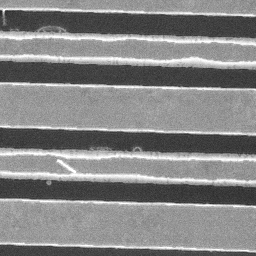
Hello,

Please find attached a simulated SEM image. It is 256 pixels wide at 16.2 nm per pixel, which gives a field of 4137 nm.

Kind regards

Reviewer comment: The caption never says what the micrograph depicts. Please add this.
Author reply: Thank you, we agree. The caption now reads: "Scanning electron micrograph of lines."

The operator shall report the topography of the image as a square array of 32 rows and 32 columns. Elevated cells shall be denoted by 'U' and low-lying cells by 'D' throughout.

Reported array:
UUUUUUUUUUUUUUUUUUUUUUUUUUUUUUUU
DDDDDDDDDDDDDDDUUUUUUUUUUUUUUUUU
DDDDDDDDDDDDDDDDDDDDDDDDDDDDDDDD
DDDDDDDDDDDDDDDDDDDDDDDDDDDDDDDD
UUUUUUUUUUUUDDDDDDDDDDDDDDDDDDDD
UUUUUUUUUUUUUUUUUUUUUUUUUUUUUUUU
UUUUUUUUUUUUUUUUUUUUUUUUUUUUUUUU
DDDDDDUUUUUUUUUUUUUUUUUUUUUUUUUU
DDDDDDDDDDDDDDDDDDDDDDDDDDDDDDDD
DDDDDDDDDDDDDDDDDDDDDDDDDDDDDDDD
UUUUUUDDDDDDDDDDDDDDDDDDDDDDDDDD
UUUUUUUUUUUUUUUUUUUUUUUUUUUUUUUU
UUUUUUUUUUUUUUUUUUUUUUUUUUUUUUUU
UUUUUUUUUUUUUUUUUUUUUUUUUUUUUUUU
UUUUUUUUUUUUUUUUUUUUUUUUUUUUUUUU
UUUUUUUUUUUUUUUUUUUUUUUUUUUUUUUU
DDDDDDDDDDDDDDDDDDDDDUUUUUUUUUUU
DDDDDDDDDDDDDDDDDDDDDDDDDDDDDDDD
DDDDDDDDDDDDDDDDDDDDDDDDDDDDDDDD
UUUUUUUUUUUUUUUUUUUUUDDDDDDDDDDD
UUUUUUUUUUUUUUUUUUUUUUUUUUUUUUUU
UUUUUUUUUUUUUUUUUUUUUUUUUUUUUUUU
DDDDDDDDDDDDDDDDDDUUUUUUUUUUUUUU
DDDDDDDDDDDDDDDDDDDDDDDDDDDDDDDD
DDDDDDDDDDDDDDDDDDDDDDDDDDDDDDDD
UUUUUUUUUUUUUUUUUUUDDDDDDDDDDDDD
UUUUUUUUUUUUUUUUUUUUUUUUUUUUUUUU
UUUUUUUUUUUUUUUUUUUUUUUUUUUUUUUU
UUUUUUUUUUUUUUUUUUUUUUUUUUUUUUUU
UUUUUUUUUUUUUUUUUUUUUUUUUUUUUUUU
UUUUUUUUUUUUUUUUUUUUUUUUUUUUUUUU
DDDDDDDDDDDDDDDDDDDDDDDDDDDDDDDD